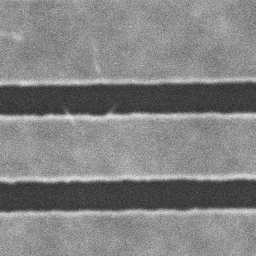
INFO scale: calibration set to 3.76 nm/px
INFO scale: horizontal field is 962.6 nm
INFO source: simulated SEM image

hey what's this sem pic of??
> lines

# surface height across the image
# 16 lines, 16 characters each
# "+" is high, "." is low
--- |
++++++++++++++++
++++++++++++++++
++++++++++++++++
++++++++++++++++
++++++++++++++++
................
................
++++++++++++++++
++++++++++++++++
++++++++++++++++
++++++++++++++++
................
................
++++++++++++++++
++++++++++++++++
++++++++++++++++